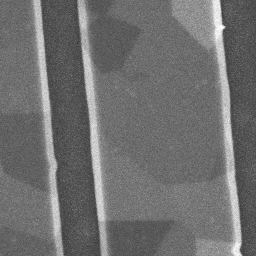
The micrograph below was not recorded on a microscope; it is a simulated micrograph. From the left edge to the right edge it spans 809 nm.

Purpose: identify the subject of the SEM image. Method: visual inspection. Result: one or a few lines or trenches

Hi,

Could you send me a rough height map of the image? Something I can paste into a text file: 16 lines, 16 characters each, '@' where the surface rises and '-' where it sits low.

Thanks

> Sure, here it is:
@@---@@@@@@@@@--
@@---@@@@@@@@@--
@@@--@@@@@@@@@--
@@@--@@@@@@@@@--
@@@--@@@@@@@@@--
@@@---@@@@@@@@--
@@@---@@@@@@@@--
@@@---@@@@@@@@--
@@@---@@@@@@@@--
@@@---@@@@@@@@--
@@@---@@@@@@@@--
@@@---@@@@@@@@--
@@@---@@@@@@@@@-
@@@---@@@@@@@@@-
@@@@--@@@@@@@@@-
@@@@--@@@@@@@@@-